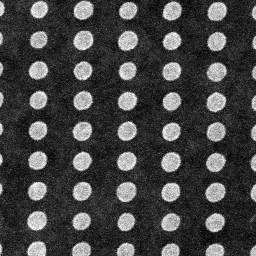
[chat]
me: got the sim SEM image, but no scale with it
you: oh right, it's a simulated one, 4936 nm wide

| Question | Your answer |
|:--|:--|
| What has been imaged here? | a regular array of raised bodies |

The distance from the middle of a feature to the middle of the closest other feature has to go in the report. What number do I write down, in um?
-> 0.58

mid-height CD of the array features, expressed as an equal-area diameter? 340 nanometers